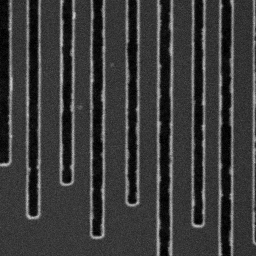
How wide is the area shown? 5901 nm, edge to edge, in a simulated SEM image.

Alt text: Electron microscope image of parallel lines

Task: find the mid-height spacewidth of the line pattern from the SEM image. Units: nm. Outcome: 490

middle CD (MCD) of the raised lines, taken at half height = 288 nanometers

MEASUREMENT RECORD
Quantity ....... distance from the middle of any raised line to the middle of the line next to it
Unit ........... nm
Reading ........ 740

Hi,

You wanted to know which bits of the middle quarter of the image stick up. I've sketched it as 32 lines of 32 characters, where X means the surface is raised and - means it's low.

XX-----XXX------XX------XXX-----
XX-----XXX------XX------XXX-----
XX-----XXX------XX------XXX-----
XX-----XXX------XX------XXX-----
XX-----XXX------XX------XXX-----
XX-----XXX------XX------XXX-----
XX-----XXX------XX------XXX-----
XX-----XXX------XX------XXX-----
XX-----XXX------XX------XXX-----
XX-----XXX------XX------XXX-----
XX-----XXX------XX------XXX-----
XX-----XXX------XX------XXX-----
XX-----XXX------XX------XXX-----
XX-----XXX------XX------XXX-----
XX-----XXX------XX------XXX-----
XX-----XXX------XX------XXX-----
XX-----XXX------XX------XXX-----
XX-----XXX------XX------XXX-----
XX-----XXX------XXX-----XXX-----
XX-----XXX------XXX-----XXX-----
XX-----XXX------XX------XXX-----
XX-----XXX------XXX-----XXX-----
XX-----XXX------XX------XXX-----
XX-----XXX------XX------XXX-----
XX-----XXX------XXX-----XXX-----
XX-----XXX------XXX-----XXX-----
XX-----XXX------XXX-----XXX-----
XX-----XXX------XX------XXX-----
XX-----XXX------XX------XXX-----
XX-----XXX------XX------XXX-----
-------XXX------XX------XXX-----
-------XXX------XX------XXX-----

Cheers